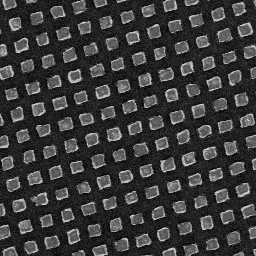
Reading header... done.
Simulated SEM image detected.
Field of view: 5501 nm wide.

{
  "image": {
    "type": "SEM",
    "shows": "a regular array of raised bodies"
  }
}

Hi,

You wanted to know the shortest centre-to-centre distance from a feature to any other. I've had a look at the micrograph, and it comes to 459 nm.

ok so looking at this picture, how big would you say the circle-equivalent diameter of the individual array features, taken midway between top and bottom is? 274 nm